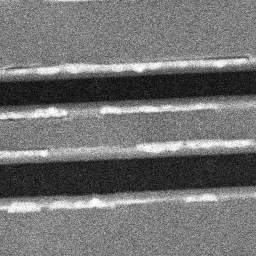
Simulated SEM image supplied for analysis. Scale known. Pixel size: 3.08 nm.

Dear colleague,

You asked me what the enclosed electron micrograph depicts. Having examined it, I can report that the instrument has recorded one or a few lines or trenches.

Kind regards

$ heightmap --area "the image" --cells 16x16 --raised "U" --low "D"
UUUUUUUUUUUUUUUU
UUUUUUUUUUUUUUUU
UUUUUUUUUUUUUUUU
UUUUUUUUUUUUUUUU
UUUUUUUUDDDDDDDD
DDDDDDDDDDDDDDDD
DDDDDDDDDDUUUUUU
UUUUUUUUUUUUUUUU
UUUUUUUUUUUUUUUU
UUUUUUUUUUDDDDDD
DDDDDDDDDDDDDDDD
DDDDDDDDDDDDDDDD
DDDDUUUUUUUUUUUU
UUUUUUUUUUUUUUUU
UUUUUUUUUUUUUUUU
UUUUUUUUUUUUUUUU